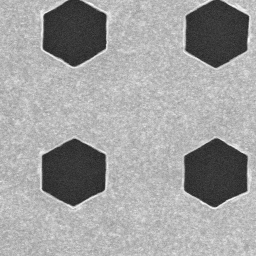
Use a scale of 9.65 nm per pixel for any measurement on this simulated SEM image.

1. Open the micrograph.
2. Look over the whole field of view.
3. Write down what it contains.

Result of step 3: holes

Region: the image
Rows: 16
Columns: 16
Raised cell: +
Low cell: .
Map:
+++...++++++...+
+++....+++++....
+++....+++++....
+++...++++++...+
++++++++++++++++
++++++++++++++++
++++++++++++++++
++++++++++++++++
++++++++++++++++
+++...++++++...+
+++....++++.....
+++....++++.....
++++.+++++++..++
++++++++++++++++
++++++++++++++++
++++++++++++++++